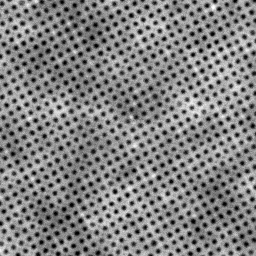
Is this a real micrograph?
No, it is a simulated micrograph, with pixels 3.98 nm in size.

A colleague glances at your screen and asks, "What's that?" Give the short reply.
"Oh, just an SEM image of a regular array of holes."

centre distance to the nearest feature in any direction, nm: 34.5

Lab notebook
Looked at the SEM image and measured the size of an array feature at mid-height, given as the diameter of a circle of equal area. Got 23.3 nanometers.